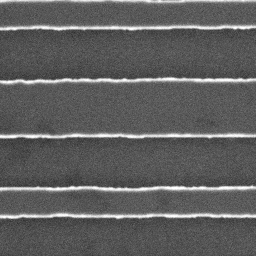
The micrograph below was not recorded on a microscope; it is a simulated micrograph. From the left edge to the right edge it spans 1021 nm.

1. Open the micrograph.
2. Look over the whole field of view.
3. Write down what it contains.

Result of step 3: lines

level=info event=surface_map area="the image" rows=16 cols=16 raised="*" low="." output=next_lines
****************
****************
................
................
................
****************
****************
****************
****************
................
................
................
****************
****************
................
................